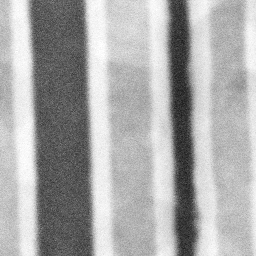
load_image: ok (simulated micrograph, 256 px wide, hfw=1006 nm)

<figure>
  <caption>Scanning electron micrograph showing one or a few lines or trenches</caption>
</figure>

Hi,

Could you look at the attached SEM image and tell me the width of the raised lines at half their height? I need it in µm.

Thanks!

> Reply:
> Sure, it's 0.247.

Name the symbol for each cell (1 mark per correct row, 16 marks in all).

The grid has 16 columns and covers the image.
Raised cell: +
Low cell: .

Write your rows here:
+.....++++..++++
+.....++++..++++
+.....++++..++++
+.....++++..++++
+.....++++..++++
+.....++++..++++
++....++++..++++
++....++++...+++
++....++++...+++
++....++++...+++
++....++++...+++
++....++++...+++
++....++++...+++
++....++++...+++
++....++++...+++
++....++++...+++